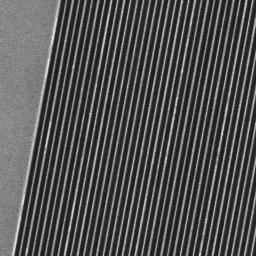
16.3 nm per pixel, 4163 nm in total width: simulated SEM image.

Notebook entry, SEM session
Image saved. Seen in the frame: parallel lines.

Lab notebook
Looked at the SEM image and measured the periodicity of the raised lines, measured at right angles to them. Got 103 nm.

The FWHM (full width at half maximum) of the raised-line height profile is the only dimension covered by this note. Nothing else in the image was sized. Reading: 32 nm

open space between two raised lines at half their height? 77.9 nanometres